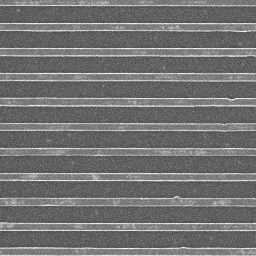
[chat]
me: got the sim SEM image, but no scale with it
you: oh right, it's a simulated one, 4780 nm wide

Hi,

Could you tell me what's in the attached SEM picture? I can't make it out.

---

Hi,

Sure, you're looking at parallel lines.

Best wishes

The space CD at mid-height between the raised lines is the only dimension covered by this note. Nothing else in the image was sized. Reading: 0.331 micrometres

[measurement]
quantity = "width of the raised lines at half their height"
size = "133 nanometres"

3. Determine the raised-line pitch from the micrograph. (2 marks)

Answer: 466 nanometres